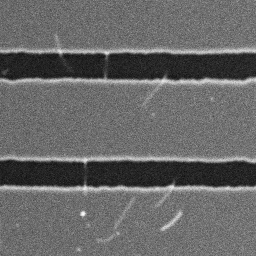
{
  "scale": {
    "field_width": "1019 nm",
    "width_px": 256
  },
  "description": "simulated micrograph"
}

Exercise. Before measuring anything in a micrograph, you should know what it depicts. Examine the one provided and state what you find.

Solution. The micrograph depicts lines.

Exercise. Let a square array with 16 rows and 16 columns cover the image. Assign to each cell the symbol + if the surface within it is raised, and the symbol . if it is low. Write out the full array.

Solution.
++++++++++++++++
++++++++++++++++
++++++++++++++++
................
................
++++++++++++++++
++++++++++++++++
++++++++++++++++
++++++++++++++++
++++++++++++++++
................
................
++++++++++++++++
++++++++++++++++
++++++++++++++++
++++++++++++++++